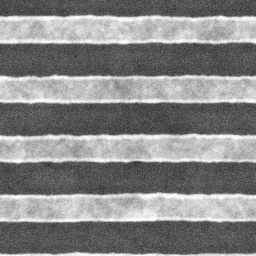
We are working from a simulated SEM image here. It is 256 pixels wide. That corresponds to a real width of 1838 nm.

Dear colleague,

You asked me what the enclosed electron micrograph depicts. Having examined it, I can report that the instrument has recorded lines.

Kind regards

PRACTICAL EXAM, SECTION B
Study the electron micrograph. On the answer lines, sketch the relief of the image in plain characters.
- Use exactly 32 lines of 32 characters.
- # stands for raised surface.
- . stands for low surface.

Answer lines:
................................
................................
################################
################################
################################
................................
................................
................................
................................
.......................#........
################################
################################
################################
................................
................................
................................
................................
################################
################################
################################
................................
................................
................................
................................
################################
################################
################################
####################...##.######
................................
................................
................................
................................